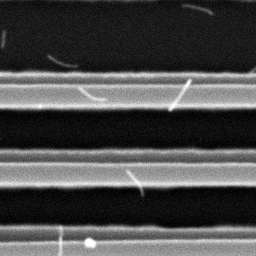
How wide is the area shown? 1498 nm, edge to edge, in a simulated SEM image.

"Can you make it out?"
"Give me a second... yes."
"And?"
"lines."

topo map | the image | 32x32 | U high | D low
DDDDDDDDDDDDDDDDDDDDDDDDDDDDDDDD
DDDDDDDDDDDDDDDDDDDDDDDDDDDDDDDD
DDDDDDDDDDDDDDDDDDDDDDDDDDDDDDDD
DDDDDDDDDDDDDDDDDDDDDDDDDDDDDDDD
DDDDDDDDDDDDDDDDDDDDDDDDDDDDDDDD
DDDDDDDDDDDDDDDDDDDDDDDDDDDDDDDD
DDDDDDDDDDDDDDDDDDDDDDDDDDDDDDDD
DDDDDDDDDDDDDDDDDDDDDDDDDDDDDDDD
DDDDDDDDDDDDDDDDDDDDDDDDDDDDDDDD
UUUUUUUUUUUUUUUUUUUUUUUUUUUUUUUU
UUUUUUUUUUUUUUUUUUUUUUUUUUUUUUUU
UUUUUUUUUUUUUUUUUUUUUUUUUUUUUUUU
UUUUUUUUUUUUUUUUUUUUUUUUUUUUUUUU
DDDDDDDDDDDDDDDDDDDDDUDDDDDDDDDD
DDDDDDDDDDDDDDDDDDDDDDDDDDDDDDDD
DDDDDDDDDDDDDDDDDDDDDDDDDDDDDDDD
DDDDDDDDDDDDDDDDDDDDDDDDDDDDDDDD
DDDDDDDDDDDDDDDDDDDDDDDDDDDDDDDD
DDDDDDDDDDDDDDDDDDDDDDDDDDDDDDDD
UUUUUUUUUUUUUUUUUUUUUUUUUUUUUUUU
UUUUUUUUUUUUUUUUUUUUUUUUUUUUUUUU
UUUUUUUUUUUUUUUUUUUUUUUUUUUUUUUU
UUUUUUUUUUUUUUUUUUUUUUUUUUUUUUUU
DDDDDDDDDDDDDDDDDDDDDDDDDDDDDDDD
DDDDDDDDDDDDDDDDDDDDDDDDDDDDDDDD
DDDDDDDDDDDDDDDDDDDDDDDDDDDDDDDD
DDDDDDDDDDDDDDDDDDDDDDDDDDDDDDDD
DDDDDDDDDDDDDDDDDDDDDDDDDDDDDDDD
UUUUUUUUDDDUDDDDDDDDDDDDDDDDDDDD
UUUUUUUUUUUUUUUUUUUUUUUUUUUUUUUU
UUUUUUUUUUUUUUUUUUUUUUUUUUUUUUUU
UUUUUUUUUUUUUUUUUUUUUUUUUUUUUUUU